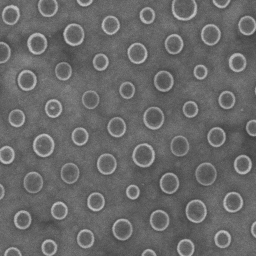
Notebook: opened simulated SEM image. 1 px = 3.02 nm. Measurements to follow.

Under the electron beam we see a regular array of raised bodies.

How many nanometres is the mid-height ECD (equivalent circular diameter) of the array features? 55.9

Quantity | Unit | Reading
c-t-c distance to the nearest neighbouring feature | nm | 114